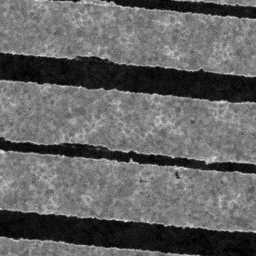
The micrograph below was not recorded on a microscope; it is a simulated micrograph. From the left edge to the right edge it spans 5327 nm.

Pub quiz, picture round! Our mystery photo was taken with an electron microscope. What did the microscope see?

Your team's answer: one or a few lines or trenches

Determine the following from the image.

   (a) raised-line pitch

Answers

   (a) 1580 nm